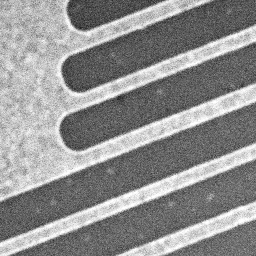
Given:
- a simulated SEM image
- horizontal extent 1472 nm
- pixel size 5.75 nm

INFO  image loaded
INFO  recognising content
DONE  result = parallel lines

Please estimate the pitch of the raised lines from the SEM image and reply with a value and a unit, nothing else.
317 nm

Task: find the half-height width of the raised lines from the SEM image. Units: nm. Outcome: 69.6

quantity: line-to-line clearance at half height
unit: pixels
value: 42.3